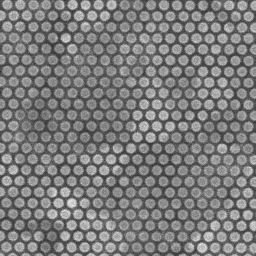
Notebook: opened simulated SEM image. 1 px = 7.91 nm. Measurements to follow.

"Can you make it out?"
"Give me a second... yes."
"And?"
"a regular array of raised bodies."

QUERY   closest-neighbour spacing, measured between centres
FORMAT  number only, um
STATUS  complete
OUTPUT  0.0999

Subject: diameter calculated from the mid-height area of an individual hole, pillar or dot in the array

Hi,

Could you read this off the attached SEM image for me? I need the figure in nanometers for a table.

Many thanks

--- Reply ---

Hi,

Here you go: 73.6